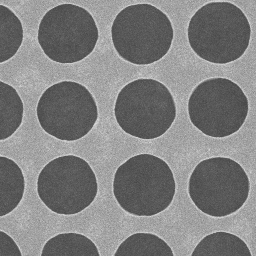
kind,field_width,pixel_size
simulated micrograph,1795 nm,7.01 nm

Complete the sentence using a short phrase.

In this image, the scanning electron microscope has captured a regular array of holes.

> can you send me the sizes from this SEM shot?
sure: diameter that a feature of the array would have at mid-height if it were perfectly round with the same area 417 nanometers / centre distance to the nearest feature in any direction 521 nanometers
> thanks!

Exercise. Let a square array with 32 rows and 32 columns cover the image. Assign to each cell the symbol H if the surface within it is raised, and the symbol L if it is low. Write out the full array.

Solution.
HHHHHHHHHHHHHHHHHLLHHHHHHHLLLHHH
LLHHHHLLLLLHHHHLLLLLHHHHHLLLLLHH
LLHHHLLLLLLLHHLLLLLLLHHHLLLLLLLH
LLLHHLLLLLLLHHLLLLLLLHHHLLLLLLLH
LLLHHLLLLLLLHHLLLLLLLLHLLLLLLLLH
LLLHHLLLLLLLHHLLLLLLLHHHLLLLLLLH
LLHHHHLLLLLHHHHLLLLLLHHHLLLLLLLH
LHHHHHHLLLHHHHHHLLLLHHHHHHLLLHHH
HHHHHHHHHHHHHHHHHHHHHHHHHHHHHHHH
HHHHHHHHHHHHHHHHHHHHHHHHHHHHHHHH
LHHHHHHLLLHHHHHHLLLLHHHHHLLLLHHH
LLHHHHLLLLLHHHHLLLLLLHHHLLLLLLHH
LLLHHLLLLLLLHHHLLLLLLLHHLLLLLLLH
LLLHHLLLLLLLHHLLLLLLLLHLLLLLLLLH
LLLHHLLLLLLLHHLLLLLLLLHHLLLLLLLH
LLLHHLLLLLLLHHHLLLLLLHHHLLLLLLHH
LLHHHHLLLLLHHHHHLLLLLHHHHLLLLHHH
HHHHHHHHLLHHHHHHHHHHHHHHHHHHHHHH
HHHHHHHHHHHHHHHHHHHHHHHHHHHHHHHH
HHHHHHHHLHHHHHHHHLLHHHHHHHHHHHHH
LLHHHHLLLLLHHHHLLLLLLHHHHLLLLLHH
LLLHHLLLLLLLHHHLLLLLLHHHLLLLLLLH
LLLHHLLLLLLLHHLLLLLLLLHHLLLLLLLH
LLLHHLLLLLLLHHLLLLLLLLHHLLLLLLLH
LLLHHLLLLLLLHHLLLLLLLLHHLLLLLLLH
LLHHHHLLLLLHHHHLLLLLLHHHLLLLLLHH
LHHHHHHLLLHHHHHHLLLLHHHHHLLLLHHH
HHHHHHHHHHHHHHHHHHHHHHHHHHHHHHHH
HHHHHHHHHHHHHHHHHHHHHHHHHHHHHHHH
LHHHHHHLLLLHHHHHLLLLHHHHHHLLLHHH
LLHHHHLLLLLLHHHLLLLLLHHHHLLLLLLH
LLLHHLLLLLLLHHLLLLLLLLHHLLLLLLLH